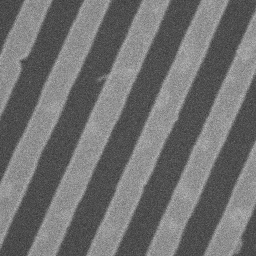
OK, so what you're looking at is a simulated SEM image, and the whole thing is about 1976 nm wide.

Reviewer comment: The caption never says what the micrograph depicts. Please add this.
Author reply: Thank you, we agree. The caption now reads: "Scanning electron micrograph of parallel lines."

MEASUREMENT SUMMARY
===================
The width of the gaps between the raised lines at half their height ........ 237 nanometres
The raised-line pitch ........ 415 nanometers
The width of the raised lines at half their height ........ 22.8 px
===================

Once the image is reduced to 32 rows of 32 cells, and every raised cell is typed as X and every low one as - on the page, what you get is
---XXX----XXXX----XXX----XXX----
---XXX----XXX----XXXX----XXX----
--XXX-----XXX----XXX----XXX-----
--XXX----XXX----XXXX----XXX----X
-XXX-----XXX----XXX----XXX-----X
-XXX----XXX-----XXX----XXX----XX
XXX-----XXX----XXX----XXXX----XX
XX-----XXX-----XXX----XXX----XXX
XX-----XXX----XXX-----XXX----XXX
XX----XXX-----XXX----XXX----XXXX
XX----XXX----XXX-----XXX----XXX-
X----XXX-----XXX----XXX-----XXX-
X----XXX----XXXX----XXX----XXX--
-----XXX----XXX----XXX-----XXX--
----XXX----XXXX----XXX----XXX---
----XXX----XXX----XXXX----XXX---
---XXX-----XXX----XXX----XXX----
---XXX----XXX-----XXX----XXX----
--XXX-----XXX----XXX----XXX-----
--XXX----XXX-----XXX----XXX----X
-XXX-----XXX----XXX----XXXX----X
-XXX----XXX-----XXX----XXX----XX
XXXX----XXX----XXX-----XXX----XX
XXX----XXXX----XXX----XXX----XXX
XXX----XXX----XXX-----XXX----XXX
XX----XXXX----XXX----XXX-----XXX
XX----XXX-----XXX----XXX----XXX-
X-----XXX----XXX----XXX-----XXX-
X----XXX-----XXX----XXX----XXX--
X----XXX----XXX----XXXX----XXX--
----XXX-----XXX----XXX----XXXX--
----XXX----XXX-----XXX----XXX---